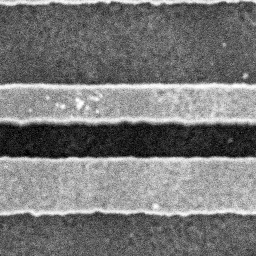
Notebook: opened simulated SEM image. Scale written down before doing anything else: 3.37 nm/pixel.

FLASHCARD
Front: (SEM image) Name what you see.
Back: lines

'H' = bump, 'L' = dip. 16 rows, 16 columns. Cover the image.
LLLLLLLLLLLLLLLL
LLLLLLLLLLLLLLLL
LLLLLLLLLLLLLLLL
LLLLLLLLLLLLLLLL
LLLLLLLLLLLLLLLL
HHHHHHHHHHHHHHHH
HHHHHHHHHHHHHHHH
HHHHHHHHHHHHHHHH
LLLLLLLLLLLLLLLL
LLLLLLLLLLLLLLLL
HHHHHHHHHHHHHHHH
HHHHHHHHHHHHHHHH
HHHHHHHHHHHHHHHH
LLLLLLLLLLLLLLLL
LLLLLLLLLLLLLLLL
LLLLLLLLLLLLLLLL